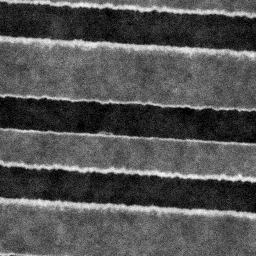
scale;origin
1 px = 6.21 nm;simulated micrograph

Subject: lines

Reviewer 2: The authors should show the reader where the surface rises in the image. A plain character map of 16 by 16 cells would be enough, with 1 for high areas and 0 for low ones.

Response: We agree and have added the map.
0000000111111111
0000000000000000
1111000000000000
1111111111111111
1111111111111111
1111111111111111
0000000001111111
0000000000000000
1111111000000000
1111111111111111
0011111111111111
0000000000000000
1100000000000000
1111111111111111
1111111111111111
1111111111111111